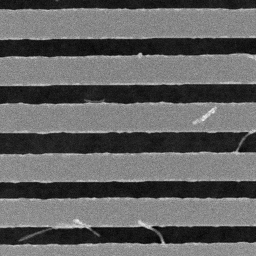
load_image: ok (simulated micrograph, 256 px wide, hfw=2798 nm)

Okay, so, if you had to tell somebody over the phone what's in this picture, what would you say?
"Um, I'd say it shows lines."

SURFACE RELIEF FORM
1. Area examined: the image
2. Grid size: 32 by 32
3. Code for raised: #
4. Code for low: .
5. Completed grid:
................................
################################
################################
################################
################################
................................
................................
################################
################################
################################
#######################.........
................................
................................
################################
################################
################################
#################.###.#...#..#.#
................................
................................
################################
################################
################################
################################
................................
................................
################################
################################
################################
.......#..........#.............
................................
.............####..##..#########
################################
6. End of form